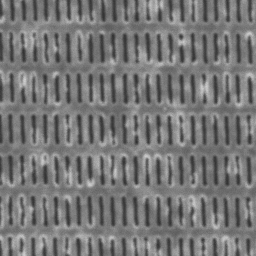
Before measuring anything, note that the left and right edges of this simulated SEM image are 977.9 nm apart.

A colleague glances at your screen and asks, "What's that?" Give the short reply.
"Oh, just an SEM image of a regular array of holes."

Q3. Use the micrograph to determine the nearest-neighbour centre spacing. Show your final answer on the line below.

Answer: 0.043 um